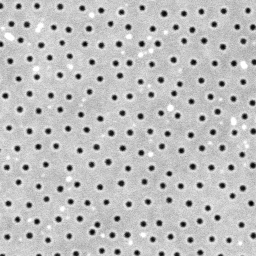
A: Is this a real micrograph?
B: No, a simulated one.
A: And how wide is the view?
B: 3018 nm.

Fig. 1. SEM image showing a regular array of holes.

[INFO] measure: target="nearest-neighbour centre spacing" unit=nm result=199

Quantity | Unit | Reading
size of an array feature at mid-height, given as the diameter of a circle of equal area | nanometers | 84.1